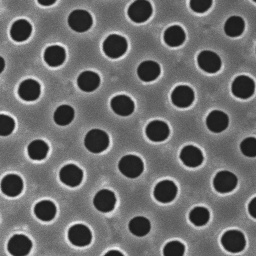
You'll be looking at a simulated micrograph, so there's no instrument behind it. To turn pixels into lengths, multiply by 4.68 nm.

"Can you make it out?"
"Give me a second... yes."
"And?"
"a regular array of holes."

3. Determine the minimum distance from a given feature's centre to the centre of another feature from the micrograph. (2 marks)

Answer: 198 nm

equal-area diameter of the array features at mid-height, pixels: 22.6